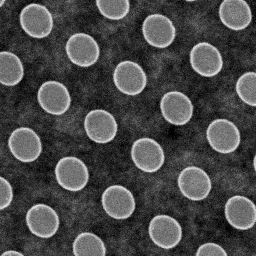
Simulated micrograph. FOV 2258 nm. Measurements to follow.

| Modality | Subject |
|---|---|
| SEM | a regular array of raised bodies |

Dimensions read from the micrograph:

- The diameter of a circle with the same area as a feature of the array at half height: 278 nm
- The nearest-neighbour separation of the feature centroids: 483 nm